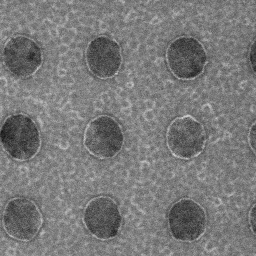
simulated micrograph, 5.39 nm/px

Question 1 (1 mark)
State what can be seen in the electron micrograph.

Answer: a regular array of raised bodies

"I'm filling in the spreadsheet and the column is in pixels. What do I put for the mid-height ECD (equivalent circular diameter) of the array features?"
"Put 41.1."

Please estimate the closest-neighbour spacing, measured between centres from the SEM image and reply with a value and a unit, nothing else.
434 nm